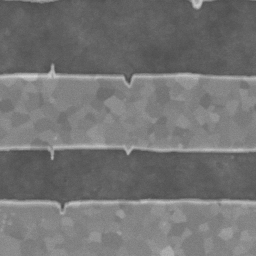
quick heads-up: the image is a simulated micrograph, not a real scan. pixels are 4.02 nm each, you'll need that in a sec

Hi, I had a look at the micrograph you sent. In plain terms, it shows one or a few lines or trenches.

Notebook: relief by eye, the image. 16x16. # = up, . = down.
................
................
................
................
................
################
################
################
################
................
................
................
................
################
################
################